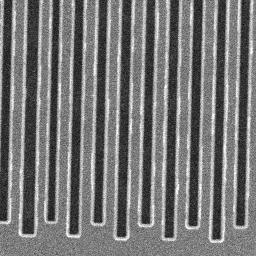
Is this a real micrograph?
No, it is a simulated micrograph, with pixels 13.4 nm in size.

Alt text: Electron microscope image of parallel lines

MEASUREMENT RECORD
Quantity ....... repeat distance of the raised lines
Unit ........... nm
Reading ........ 319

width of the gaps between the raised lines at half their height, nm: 148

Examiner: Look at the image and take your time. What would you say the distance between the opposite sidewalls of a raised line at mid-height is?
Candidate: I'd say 12.5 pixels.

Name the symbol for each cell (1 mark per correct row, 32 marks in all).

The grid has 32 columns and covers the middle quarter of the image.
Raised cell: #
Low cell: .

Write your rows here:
##...###...###...###...###...###
##...###...###...###...###...###
##...###...###...###...###...###
##...###...###...###...###...###
##...###...###...###...###...###
##...###...###...###...###...##.
##...###...###...###...###...##.
##...###...###...###...###...##.
##...###...###...###...###...##.
##...###...###...###...###...##.
##...###...###...###...###...##.
##...##....###...###...##....##.
##...###...###...###...##....##.
##...###...###...###...##....##.
##...###...##....###...##....##.
##...###...##....###..###....##.
##...###...##....###..###....##.
#....###...##....##...###...###.
#....###..###....##...###...###.
#....###..###....##...###...###.
#....##...###....##...###...###.
#....##...###...###...###...###.
#....##...###...###...###...###.
#....##...###...###...###...###.
#...###...###...###...###...###.
#...###...###...###...###...###.
#...###...###...###...###...###.
#...###...###...###...###...###.
#...###...###...###...###...###.
#...###...###...###...###...###.
#...###...###...###...###...###.
#...###...###...###...###...###.